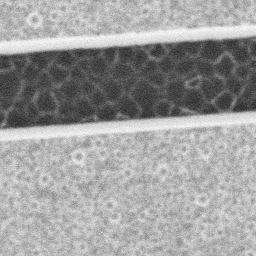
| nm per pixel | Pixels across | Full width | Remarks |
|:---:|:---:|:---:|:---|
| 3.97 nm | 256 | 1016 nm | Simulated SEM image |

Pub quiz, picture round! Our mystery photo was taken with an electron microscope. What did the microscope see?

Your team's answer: one or a few lines or trenches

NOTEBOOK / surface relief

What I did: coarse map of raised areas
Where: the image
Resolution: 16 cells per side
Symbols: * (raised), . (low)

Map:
****************
****************
*******.........
................
................
................
................
..............**
****************
****************
****************
****************
****************
****************
****************
****************